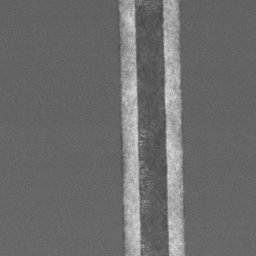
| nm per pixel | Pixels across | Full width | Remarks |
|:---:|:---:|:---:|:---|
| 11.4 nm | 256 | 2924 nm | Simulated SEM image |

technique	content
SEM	one or a few lines or trenches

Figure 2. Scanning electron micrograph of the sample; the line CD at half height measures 481 nm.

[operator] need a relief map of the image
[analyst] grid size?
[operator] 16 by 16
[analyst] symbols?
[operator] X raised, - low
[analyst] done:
--------XXX-----
--------XXX-----
--------XXX-----
--------XXX-----
--------XXX-----
--------XXX-----
--------XXX-----
--------XXX-----
--------XXX-----
--------XXX-----
--------XXX-----
--------XXX-----
--------XXX-----
--------XXX-----
--------XXX-----
--------XXX-----